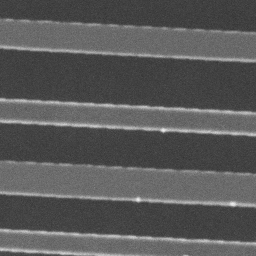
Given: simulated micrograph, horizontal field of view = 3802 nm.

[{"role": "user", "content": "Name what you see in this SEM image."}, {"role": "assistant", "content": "lines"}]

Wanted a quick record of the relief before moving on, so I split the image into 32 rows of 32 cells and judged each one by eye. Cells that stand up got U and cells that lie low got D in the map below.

DDDDDDDDDDDDDDDDDDDDDDDDDDDDDDDD
DDDDDDDDDDDDDDDDDDDDDDDDDDDDDDDD
UUDDDDDDDDDDDDDDDDDDDDDDDDDDDDDD
UUUUUUUUUUUUUUUUUUUDDDDDDDDDDDDD
UUUUUUUUUUUUUUUUUUUUUUUUUUUUUUUU
UUUUUUUUUUUUUUUUUUUUUUUUUUUUUUUU
DDDDDDDDDDUUUUUUUUUUUUUUUUUUUUUU
DDDDDDDDDDDDDDDDDDDDDDDDDDDDDDUU
DDDDDDDDDDDDDDDDDDDDDDDDDDDDDDDD
DDDDDDDDDDDDDDDDDDDDDDDDDDDDDDDD
DDDDDDDDDDDDDDDDDDDDDDDDDDDDDDDD
DDDDDDDDDDDDDDDDDDDDDDDDDDDDDDDD
UDDDDDDDDDDDDDDDDDDDDDDDDDDDDDDD
UUUUUUUUUUUUUUUUUUUUUDDDDDDDDDDD
UUUUUUUUUUUUUUUUUUUUUUUUUUUUUUUU
DDDDDUUUUUUUUUUUUUUUUUUUUUUUUUUU
DDDDDDDDDDDDDDDDDDDDDDDDDUUUUUUU
DDDDDDDDDDDDDDDDDDDDDDDDDDDDDDDD
DDDDDDDDDDDDDDDDDDDDDDDDDDDDDDDD
DDDDDDDDDDDDDDDDDDDDDDDDDDDDDDDD
UUUUUUDDDDDDDDDDDDDDDDDDDDDDDDDD
UUUUUUUUUUUUUUUUUUUUUUUUUUUDDDDD
UUUUUUUUUUUUUUUUUUUUUUUUUUUUUUUU
UUUUUUUUUUUUUUUUUUUUUUUUUUUUUUUU
DDDDDDUUUUUUUUUUUUUUUUUUUUUUUUUU
DDDDDDDDDDDDDDDDDDDDDDDDDDDDUUUU
DDDDDDDDDDDDDDDDDDDDDDDDDDDDDDDD
DDDDDDDDDDDDDDDDDDDDDDDDDDDDDDDD
DDDDDDDDDDDDDDDDDDDDDDDDDDDDDDDD
UUUUUUUUUUUUUUUDDDDDDDDDDDDDDDDD
UUUUUUUUUUUUUUUUUUUUUUUUUUUUUUUU
DDDDUUUUUUUUUUUUUUUUUUUUUUUUUUUU